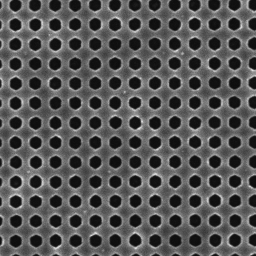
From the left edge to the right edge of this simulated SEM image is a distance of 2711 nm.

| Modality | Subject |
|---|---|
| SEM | a regular array of holes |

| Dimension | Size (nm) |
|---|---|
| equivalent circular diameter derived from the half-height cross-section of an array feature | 131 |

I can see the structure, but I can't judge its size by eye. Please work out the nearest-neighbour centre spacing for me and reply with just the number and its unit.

207 nm